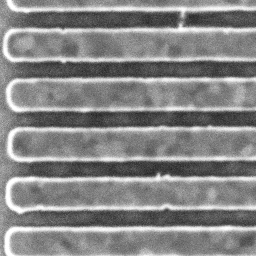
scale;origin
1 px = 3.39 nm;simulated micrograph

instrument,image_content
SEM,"parallel lines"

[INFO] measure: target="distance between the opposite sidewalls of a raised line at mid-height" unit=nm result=104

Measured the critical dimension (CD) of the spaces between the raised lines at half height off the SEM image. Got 64.9 nm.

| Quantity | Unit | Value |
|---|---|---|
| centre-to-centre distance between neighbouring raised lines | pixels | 49.6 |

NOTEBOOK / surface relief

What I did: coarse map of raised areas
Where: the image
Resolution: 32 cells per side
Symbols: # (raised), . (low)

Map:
.###############################
................................
................................
................................
.###############################
.###############################
.###############################
....#..#.########.######...#....
................................
................................
.###############################
.###############################
.###############################
..##############################
................................
................................
..##############################
.###############################
.###############################
..##############################
................................
................................
..##############################
.###############################
.###############################
.###############################
................................
................................
.....................###....##..
.###############################
.###############################
.###############################